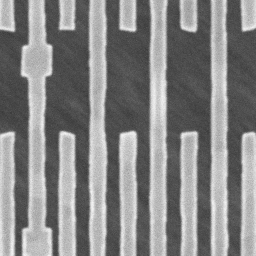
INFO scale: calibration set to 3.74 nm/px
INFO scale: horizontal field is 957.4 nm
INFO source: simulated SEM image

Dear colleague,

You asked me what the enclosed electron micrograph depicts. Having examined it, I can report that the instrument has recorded wiring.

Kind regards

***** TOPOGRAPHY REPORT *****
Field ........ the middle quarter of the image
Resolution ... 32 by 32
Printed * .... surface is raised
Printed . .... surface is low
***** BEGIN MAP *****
.......***............***.......
.......***............***.......
.......***............***.......
.......***............***.......
.......***............***.......
.......***............***.......
.......***............***.......
.......***............***.......
.......***............***.......
.......***............***.......
.......***............***.......
.......***............***.......
.......***............***.......
.......***............***.......
.......***............***.......
.......***............***.......
.......***............***.......
**.....***....****....***.....**
**.....***....****....***....***
**.....***....****....***....***
**.....***....****....***....***
**.....****...****....***....***
**.....****...****....****...***
**.....****...****....****...***
**.....****...****....****...***
**.....****...****....***....***
***....****...****....***....***
***....***....****....***....***
***....****...****....***....***
***....***....****....***....***
***....***....****....***....***
***....***....****....***....***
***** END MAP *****